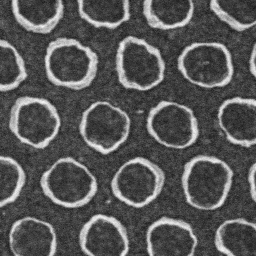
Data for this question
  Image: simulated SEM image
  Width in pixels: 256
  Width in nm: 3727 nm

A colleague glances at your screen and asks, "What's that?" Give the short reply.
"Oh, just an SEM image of a regular array of raised bodies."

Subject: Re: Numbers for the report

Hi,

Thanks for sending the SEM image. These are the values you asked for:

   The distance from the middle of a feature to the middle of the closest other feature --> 979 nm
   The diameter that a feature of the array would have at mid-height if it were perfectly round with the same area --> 47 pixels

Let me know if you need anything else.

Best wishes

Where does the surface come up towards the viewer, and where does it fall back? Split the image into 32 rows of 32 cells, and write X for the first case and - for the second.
--XXXXXX--XXXXXX--XXXXXX---XXXXX
--XXXXX---XXXXXX--XXXXXX---XXXXX
---XXXX----XXXXX---XXXX-----XXXX
----XX--------------------------
--------------------------------
X------XXX-----XXX------XXX-----
XX----XXXXX----XXXXX---XXXXX----
XX----XXXXXX---XXXXX--XXXXXXX---
XXX---XXXXXX---XXXXX---XXXXXX---
XXX---XXXXX----XXXXX---XXXXXX---
XX------XX-----XXXXX----XXXX----
--------------------------------
---XX-----------------------XX--
--XXXXX----XXX------XXX-----XXXX
--XXXXX----XXXXX---XXXXX---XXXXX
--XXXXX---XXXXXX--XXXXXX----XXXX
--XXXXX---XXXXXX---XXXXX----XXXX
---XXX-----XXXXX----XXXX-----XXX
------------XX------------------
--------------------------------
XX-----XXX------XXX-----XXXX----
XXX---XXXXX----XXXXX---XXXXXX---
XXX--XXXXXXX--XXXXXX---XXXXXX---
XX---XXXXXXX--XXXXXX---XXXXX----
XX----XXXXX----XXXX----XXXXX----
--------XX-------X------XXXX----
--------------------------------
---X-------XXX------------------
--XXXX-----XXXX----XXXX----XXXXX
-XXXXXX---XXXXXX--XXXXXX---XXXXX
-XXXXXX---XXXXXX--XXXXXX---XXXXX
--XXXXX----XXXXX---XXXXX----XXXX